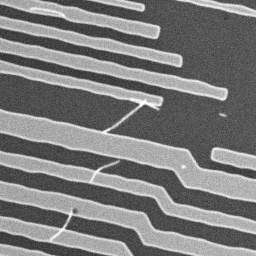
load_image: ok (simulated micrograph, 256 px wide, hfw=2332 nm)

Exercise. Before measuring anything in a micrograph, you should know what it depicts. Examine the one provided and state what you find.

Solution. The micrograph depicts groups of lines, slits or small figures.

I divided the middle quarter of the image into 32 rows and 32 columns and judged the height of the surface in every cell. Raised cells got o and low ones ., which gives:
ooooooooooooooo............oo...
.....ooooooooooooooo............
...........ooooooooooooo........
ooo...........ooooooooooooooo...
ooooooo.............oooooooooooo
oooooooooooo............oooooooo
.....ooooooooooo............oooo
.........oooooooooooo...........
.............oooooooooooo.......
..................ooooooo.......
................................
................................
................................
................................
................................
oooo............................
oooooooo........................
ooooooooooo.....................
oooooooooooooooo................
oooooooooooooooooooooo..........
oooooooooooooooooooooooooo......
...oooooooooooooooooooooooooooo.
.........ooooooooooooooooooooooo
..............oooooooooooooooooo
..................oooooooooooooo
o.....................oooooooooo
ooooooo.o..................ooooo
oooooooooo..................oooo
ooooooooooooooo..............ooo
.....oooooooooooooooo........ooo
..........oooooooooooooo......oo
.............oooooooooooo.......